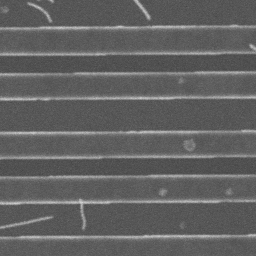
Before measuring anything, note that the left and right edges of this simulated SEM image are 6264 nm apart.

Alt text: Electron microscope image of lines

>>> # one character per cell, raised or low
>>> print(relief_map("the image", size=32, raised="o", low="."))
................................
................................
................................
.....ooooooooooooooooooooooooooo
oooooooooooooooooooooooooooooooo
oooooooooooooooooooooooooooooooo
oooooooooooooooooooooooooooooooo
................................
................................
oooooooooooooooooooooooooooooooo
oooooooooooooooooooooooooooooooo
oooooooooooooooooooooooooooooooo
................................
................................
................................
................................
.................ooooooooooooooo
oooooooooooooooooooooooooooooooo
oooooooooooooooooooooooooooooooo
oooooooooooooooooooooooooooooooo
................................
................................
oooooooooooooooooooooooooooooooo
oooooooooooooooooooooooooooooooo
oooooooooooooooooooooooooooooooo
................................
................................
................................
................................
...................ooooooooooooo
oooooooooooooooooooooooooooooooo
oooooooooooooooooooooooooooooooo